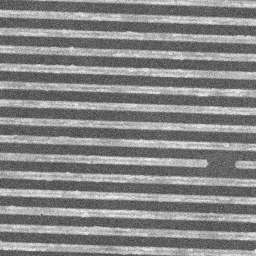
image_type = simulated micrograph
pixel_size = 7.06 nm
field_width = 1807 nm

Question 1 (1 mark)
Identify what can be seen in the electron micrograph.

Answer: parallel lines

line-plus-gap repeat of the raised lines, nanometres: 126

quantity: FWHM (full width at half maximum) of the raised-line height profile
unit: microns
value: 0.0503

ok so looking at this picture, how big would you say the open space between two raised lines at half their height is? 76.8 nm